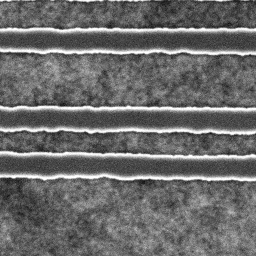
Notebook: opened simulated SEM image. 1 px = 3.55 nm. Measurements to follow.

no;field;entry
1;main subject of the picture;lines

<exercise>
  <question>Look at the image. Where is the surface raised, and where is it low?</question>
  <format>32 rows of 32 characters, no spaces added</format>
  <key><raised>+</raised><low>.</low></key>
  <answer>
................................
................................
................................
................................
++++++++++++++++++++++++++++++++
++++++++++++++++++++++++++++++++
...+++++++++++++++++++++++++++++
................................
................................
................................
................................
................................
................................
++++++++++++++++++++++.++++.+...
++++++++++++++++++++++++++++++++
++++++++++++++++++++++++++++++++
...........+++.....++..+++++++++
................................
................................
++++++++++++++++++++++++.+.+++++
++++++++++++++++++++++++++++++++
++++++++++++++++++++++++++++++++
..........................++..++
................................
................................
................................
................................
................................
................................
................................
................................
................................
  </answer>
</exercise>